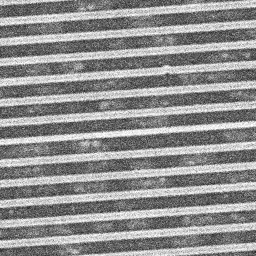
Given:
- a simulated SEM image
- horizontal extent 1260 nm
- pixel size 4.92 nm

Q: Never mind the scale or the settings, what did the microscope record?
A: parallel lines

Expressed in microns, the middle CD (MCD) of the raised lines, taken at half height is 0.0319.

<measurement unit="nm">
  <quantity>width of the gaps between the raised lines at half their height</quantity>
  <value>67.4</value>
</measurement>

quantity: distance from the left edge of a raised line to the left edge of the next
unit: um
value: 0.0993